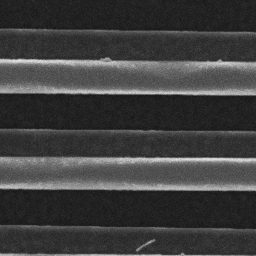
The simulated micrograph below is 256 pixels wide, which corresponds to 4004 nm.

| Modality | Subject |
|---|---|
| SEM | lines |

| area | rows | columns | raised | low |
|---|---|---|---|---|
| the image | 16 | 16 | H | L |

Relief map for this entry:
LLLLLLLLLLLLLLLL
LLLLLLLLLLLLLLLL
HHHHHHHHHHHHHHHH
HHHHHHHHHHHHHHHH
HHHHHHHHHHHHHHHH
HHHHHHHHHHHHHHHH
LLLLLLLLLLLLLLLL
LLLLLLLLLLLLLLLL
HHHHHHHHHHHHHHHH
HHHHHHHHHHHHHHHH
HHHHHHHHHHHHHHHH
HHHHHHHHHHHHHHHH
LLLLLLLLLLLLLLLL
LLLLLLLLLLLLLLLL
HHHHHHHHHHHHHHHH
HHHHHHHHHHHHHHHH